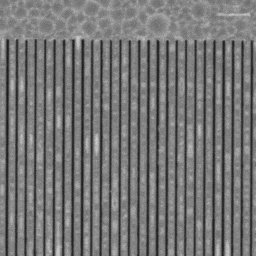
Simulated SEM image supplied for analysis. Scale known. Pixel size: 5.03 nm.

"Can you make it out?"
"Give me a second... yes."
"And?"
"parallel lines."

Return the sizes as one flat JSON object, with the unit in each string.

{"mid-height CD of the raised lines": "33.3 nm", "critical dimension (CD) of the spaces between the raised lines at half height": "2.88 pixels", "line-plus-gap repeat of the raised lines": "47.3 nm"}